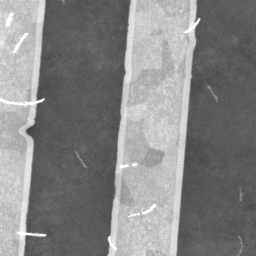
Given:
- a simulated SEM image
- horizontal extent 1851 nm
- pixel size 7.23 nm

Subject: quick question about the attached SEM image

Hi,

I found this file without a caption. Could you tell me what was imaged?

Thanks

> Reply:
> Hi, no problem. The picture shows one or a few lines or trenches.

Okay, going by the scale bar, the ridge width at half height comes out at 0.443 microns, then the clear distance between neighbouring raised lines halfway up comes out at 655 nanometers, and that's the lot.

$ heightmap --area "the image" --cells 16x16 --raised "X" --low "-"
XXX-----XXXX----
XXX-----XXXX----
XX------XXXX----
XX------XXXX----
XX------XXXX----
XX------XXXX----
XX------XXXX----
XX------XXXX----
XX------XXX-----
XX------XXX-----
XX-----XXXX-----
XX-----XXXX-----
XX-----XXXX-----
XX-----XXXX-----
X------XXXX-----
X------XXXX-----